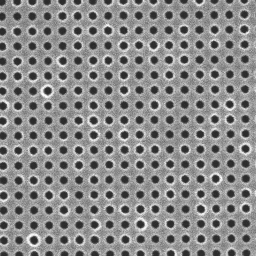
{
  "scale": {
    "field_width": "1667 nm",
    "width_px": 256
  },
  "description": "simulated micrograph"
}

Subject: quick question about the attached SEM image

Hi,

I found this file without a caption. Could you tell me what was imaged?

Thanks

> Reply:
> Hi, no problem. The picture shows a regular array of holes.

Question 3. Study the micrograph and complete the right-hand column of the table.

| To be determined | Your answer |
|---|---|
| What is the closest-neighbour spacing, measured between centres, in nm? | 95.9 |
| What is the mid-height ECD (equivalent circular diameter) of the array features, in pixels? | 8.22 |